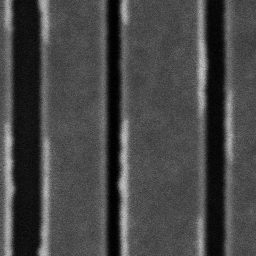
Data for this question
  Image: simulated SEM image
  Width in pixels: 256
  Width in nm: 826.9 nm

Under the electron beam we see one or a few lines or trenches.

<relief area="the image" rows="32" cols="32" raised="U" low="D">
UDDDDUUUUUUUUDDUUUUUUUUUUUDDUUUU
UDDDDUUUUUUUUDDUUUUUUUUUUUDDUUUU
UDDDDUUUUUUUUDDUUUUUUUUUUUDDUUUU
UDDDDUUUUUUUUDDUUUUUUUUUUUDDUUUU
UDDDDUUUUUUUUDDUUUUUUUUUUUDDUUUU
UDDDDUUUUUUUUDDUUUUUUUUUUUDDUUUU
UDDDDUUUUUUUUDDUUUUUUUUUUUDDUUUU
UDDDDUUUUUUUUDDUUUUUUUUUUUDDUUUU
UDDDDUUUUUUUUDDUUUUUUUUUUUDDUUUU
UDDDDUUUUUUUUDDUUUUUUUUUUUDDUUUU
UDDDDUUUUUUUUDDUUUUUUUUUUUDDUUUU
UDDDDUUUUUUUUDDUUUUUUUUUUUDDUUUU
UDDDDUUUUUUUUDDUUUUUUUUUUUDDUUUU
UDDDDUUUUUUUUDDUUUUUUUUUUUDDUUUU
UDDDDUUUUUUUUDDUUUUUUUUUUUDDUUUU
UDDDDUUUUUUUUDDUUUUUUUUUUUDDUUUU
UDDDDUUUUUUUUDDUUUUUUUUUUUDDUUUU
UUDDDUUUUUUUUDDUUUUUUUUUUUDDUUUU
UDDDDUUUUUUUUDDUUUUUUUUUUUDDUUUU
UDDDDUUUUUUUUDDUUUUUUUUUUUDDUUUU
UUDDDUUUUUUUUDDUUUUUUUUUUUDDUUUU
UDDDDUUUUUUUUDDUUUUUUUUUUUDDUUUU
UUDDDUUUUUUUUDDUUUUUUUUUUUDDUUUU
UUDDDUUUUUUUUDDUUUUUUUUUUUDDUUUU
UUDDDUUUUUUUUDDUUUUUUUUUUUDDUUUU
UDDDDUUUUUUUUDDUUUUUUUUUUUDDUUUU
UDDDDUUUUUUUUDDUUUUUUUUUUDDDUUUU
UDDDDUUUUUUUUDDUUUUUUUUUUUDDUUUU
UDDDDUUUUUUUUDDUUUUUUUUUUDDDUUUU
UDDDDUUUUUUUUDDUUUUUUUUUUDDDUUUU
UDDDDUUUUUUUUDDUUUUUUUUUUDDDUUUU
UDDDDUUUUUUUUDDUUUUUUUUUUUDDUUUU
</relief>